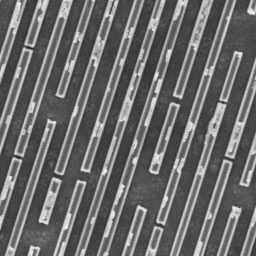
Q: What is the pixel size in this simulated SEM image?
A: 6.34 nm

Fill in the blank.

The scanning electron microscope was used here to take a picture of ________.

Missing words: parallel lines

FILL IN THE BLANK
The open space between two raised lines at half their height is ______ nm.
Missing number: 89.1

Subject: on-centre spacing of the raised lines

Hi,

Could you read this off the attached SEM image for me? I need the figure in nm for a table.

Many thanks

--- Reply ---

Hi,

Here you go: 142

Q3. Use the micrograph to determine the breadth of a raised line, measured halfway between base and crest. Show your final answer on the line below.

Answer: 53.6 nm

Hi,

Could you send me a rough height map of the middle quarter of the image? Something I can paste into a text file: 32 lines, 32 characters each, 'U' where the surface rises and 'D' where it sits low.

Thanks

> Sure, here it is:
UUDDDDUUDDDDUUUDDDUUDDDDUUDDDDUU
UUDDDDUUDDDDUUDDDDUUDDDUUDDDDUUU
UUDDDUUUDDDDUUDDDUUDDDDUUDDDDUUD
UDDDDUUDDDDDUUDDDUUDDDDUUDDDDUUD
UDDDDUUDDDDUUDDDDUUDDDUUDDDDUUUD
UDDDDUUDDDDUUDDDUUDDDDUUDDDDUUDD
UDDDUUDDDDDUUDDDUUDDDDUUDDDDUUDD
DDDDUUDDDDUUDDDDUUDDDUUDDDDUUUDD
DDDDUUDDDDUUDDDUUUDDDUUDDDDDDDDD
DDDUUDDDDDUUDDDUUDDDDUUDDDDDDDDD
DDDUUDDDDUUDDDDUUDDDUUUDDDUUDDDD
DDDUUDDDDUUDDDUUUDDDUUDDDDUUDDDD
DDUUDDDDDUUDDDUUDDDDUUDDDDUUDDDD
DDUUDDDDUUUDDDUUDDDUUUDDDDUUDDDU
DDUUDDDDUUDDDUUUDDDUUDDDDUUDDDDU
DUUUDDDDUUDDDUUDDDDUUDDDDUUDDDDU
DUUDDDDUUUDDDUUDDDUUUDDDDUUDDDUU
DUUDDDDUUDDDUUUDDDUUDDDDUUDDDDUU
UUUDDDDUUDDDUUDDDDUUDDDDUUDDDDUU
UUDDDDUUUDDDUUDDDUUUDDDDUUDDDUUU
UUDDDDUUDDDDUUDDDUUDDDDUUDDDDUUD
UUDDDDUUDDDUUDDDDUUDDDDUUDDDDUUD
UDDDDUUUDDDUUDDDDUUDDDDUUDDDDUUD
UDDDDUUDDDDUUDDDUUDDDDUUUDDDUUDD
UDDDDUUDDDUUDDDDUUDDDDUUDDDDUUDD
DDDDDUUDDDUUDDDDUUDDDDUUDDDDUUDD
DDDDDUDDDDUUDDDUUDDDDDUUDDDUUDDD
DDDDDDDDDUUDDDDUUDDDDDDDDDDUUDDD
DDDDDDDDDUUDDDDUUDDDDDDDDDDUUDDD
DDDUDDDDDUUDDDUUDDDDDDDDDDUUUDDD
DDDUUDDDUUUDDDUUDDDDDDDDDDUUDDDD
DDDUUDDDUUDDDDUUDDDDDDDDDDUUDDDD